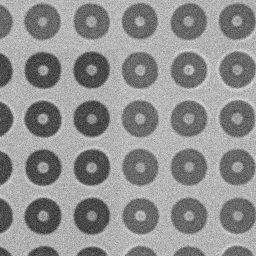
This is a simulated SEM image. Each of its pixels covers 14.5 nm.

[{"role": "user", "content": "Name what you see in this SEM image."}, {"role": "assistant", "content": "an array of small figures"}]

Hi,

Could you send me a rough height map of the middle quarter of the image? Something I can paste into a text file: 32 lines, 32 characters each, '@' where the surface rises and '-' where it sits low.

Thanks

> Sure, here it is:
@@----@-----@@----------@@@-----
@@----@@----@@----@@----@@@---@@
@@----@----@@@-----@----@@@-----
@@@--------@@@@--------@@@@-----
@@@--------@@@@--------@@@@@----
@@@@------@@@@@@------@@@@@@@---
@@@@@@@@@@@@@@@@@@@@@@@@@@@@@@@@
@@@@@@@@@@@@@@@@@@@@@@@@@@@@@@@@
@@@@@@@@@@@@@@@@@@@@@@@@@@@@@@@@
@@@@@----@@@@@@@@----@@@@@@@@---
@@@-------@@@@@--------@@@@@----
@@@--------@@@@--------@@@@-----
@@---------@@@----------@@@-----
@@----@@----@@----@@----@@----@@
@@----@@----@@----@@----@@-----@
@@@--------@@@@--------@@@@-----
@@@--------@@@@--------@@@@-----
@@@@------@@@@@@------@@@@@@----
@@@@@@--@@@@@@@@@@@@@@@@@@@@@@@@
@@@@@@@@@@@@@@@@@@@@@@@@@@@@@@@@
@@@@@@@@@@@@@@@@@@@@@@@@@@@@@@@@
@@@@@-----@@@@@@@----@@@@@@@@---
@@@@-------@@@@@------@@@@@@----
@@@--------@@@@--------@@@@-----
@@----------@@@---------@@@-----
@@----@@----@@----@@----@@----@@
@@----@@----@@@---@@----@@@----@
@@---------@@@@---------@@@-----
@@@--------@@@@--------@@@@-----
@@@@------@@@@@@------@@@@@@----
@@@@@---@@@@@@@@@@--@@@@@@@@@@--
@@@@@@@@@@@@@@@@@@@@@@@@@@@@@@@@